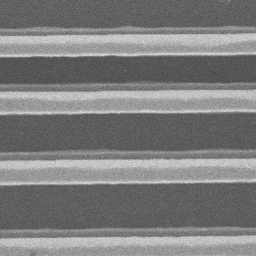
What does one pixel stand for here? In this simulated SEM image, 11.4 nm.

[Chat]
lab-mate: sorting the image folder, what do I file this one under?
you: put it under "lines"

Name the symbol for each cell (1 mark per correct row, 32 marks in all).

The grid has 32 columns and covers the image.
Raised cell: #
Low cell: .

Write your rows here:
................................
................................
................................
................................
################################
################################
################################
................................
................................
................................
.......................###.#####
################################
################################
################################
................................
................................
................................
................................
................................
################################
################################
################################
################################
................................
................................
................................
................................
................................
................................
################################
################################
################################